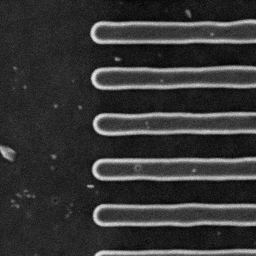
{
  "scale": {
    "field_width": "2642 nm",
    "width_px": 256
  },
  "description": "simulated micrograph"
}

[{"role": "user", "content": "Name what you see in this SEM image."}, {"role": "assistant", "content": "groups of lines, slits or small figures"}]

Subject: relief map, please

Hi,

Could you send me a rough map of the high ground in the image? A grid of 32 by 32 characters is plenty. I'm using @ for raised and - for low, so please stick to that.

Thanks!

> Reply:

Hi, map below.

--------------------------------
--------------------------------
--------------------------------
------------@@@@@@@@@@@@@@@@@@@@
------------@@@@@@@@@@@@@@@@@@@@
--------------------------------
--------------------------------
--------------------------------
---------------------------@@@@@
------------@@@@@@@@@@@@@@@@@@@@
------------@@@@@@@@@@@@@@@@@@@@
--------------------------------
--------------------------------
--------------------------------
------------@@@@@@@@@@@@@@@@@@@@
------------@@@@@@@@@@@@@@@@@@@@
------------@@@@@@@@@@---@@-@---
--------------------------------
--------------------------------
--------------------------------
------------@@@@@@@@@@@@@@@@@@@@
------------@@@@@@@@@@@@@@@@@@@@
--------------------------------
--------------------------------
--------------------------------
--------------------------------
------------@@@@@@@@@@@@@@@@@@@@
------------@@@@@@@@@@@@@@@@@@@@
--------------------------------
--------------------------------
--------------------------------
------------------@@@@@@@@@@@@@@